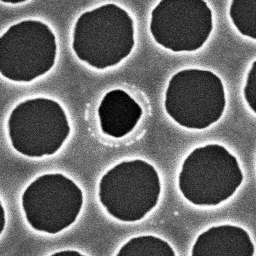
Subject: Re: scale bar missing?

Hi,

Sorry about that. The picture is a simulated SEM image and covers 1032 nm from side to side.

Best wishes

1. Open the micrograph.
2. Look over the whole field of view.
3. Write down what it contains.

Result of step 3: holes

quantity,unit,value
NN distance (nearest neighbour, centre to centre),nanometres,312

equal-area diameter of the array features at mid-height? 248 nm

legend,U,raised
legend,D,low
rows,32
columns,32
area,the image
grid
UUUUUUUUUUUUUDUUUUUUDDDDDDUUUDDD
UUUUUUUUUUUDDDDDUUUDDDDDDDUUUDDD
UUUDUUUUUUDDDDDDDUUDDDDDDDDUUDDD
UDDDDDUUUDDDDDDDDUUDDDDDDDDUUUDD
DDDDDDDUUDDDDDDDDUUDDDDDDDUUUUUD
DDDDDDDUUDDDDDDDDUUUDDDDDUUUUUUU
DDDDDDDUUDDDDDDDUUUUUUUUUUUUUUUU
DDDDDDDUUUDDDDDUUUUUUUUUUUUUUUUU
DDDDDDUUUUUUDUUUUUUUUUUUUUUUUUUD
DDDDDUUUUUUUUUUUUUUUUUDDDDDUUUUD
UUUUUUUUUUUUUUUUUUUUUDDDDDDDUUUD
UUUUUUUUUUUUUUDDUUUUUDDDDDDDUUDD
UUUDDDUUUUUUUDDDDUUUUDDDDDDDUUUD
UUDDDDDDUUUUDDDDDDUUUDDDDDDDUUUD
UDDDDDDDUUUUDDDDDDUUUDDDDDDDUUUU
UDDDDDDDDUUUUDDDDUUUUUDDDDDUUUUU
UDDDDDDDDUUUUDDDUUUUUUUUUUUUUUUU
UDDDDDDDUUUUUUUUUUUUUUUUUUUUUUUU
UUDDDDDDUUUUUUUUUUUUUUUUUDDDUUUU
UUUDDUUUUUUUUUUUUUUUUUUDDDDDDUUU
UUUUUUUUUUUUUUUDDDDUUUUDDDDDDDUU
UUUUUUUUUUUUUDDDDDDDUUUDDDDDDDUU
UUUUDDDDDUUUUDDDDDDDUUDDDDDDDDUU
UUUDDDDDDDUUDDDDDDDDUUDDDDDDDDUU
UUUDDDDDDDUUDDDDDDDDUUUDDDDDDUUU
UUUDDDDDDDUUUDDDDDDDUUUUDDDUUUUU
DUUDDDDDDDUUUDDDDDDUUUUUUUUUUUUU
DUUDDDDDDUUUUUUDDUUUUUUUUUUUUUUU
UUUUDDDDUUUUUUUUUUUUUUUUUUDDDDUU
UUUUUUUUUUUUUUUUUUDUUUUUUDDDDDDU
UUUUUUUUUUUUUUUUDDDDDUUUDDDDDDDD
UUUUUUUDDDUUUUUDDDDDDDUUDDDDDDDD